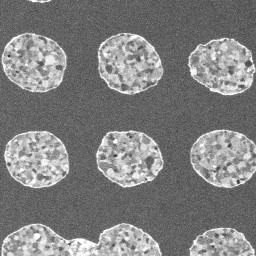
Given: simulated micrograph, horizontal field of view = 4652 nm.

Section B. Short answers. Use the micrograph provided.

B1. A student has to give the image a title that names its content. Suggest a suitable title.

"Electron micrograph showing raised bodies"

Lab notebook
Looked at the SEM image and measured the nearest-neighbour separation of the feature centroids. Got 1.7 um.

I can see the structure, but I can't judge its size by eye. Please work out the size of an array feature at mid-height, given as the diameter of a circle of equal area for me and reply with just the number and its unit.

1090 nm